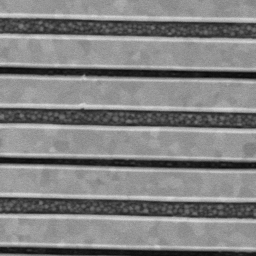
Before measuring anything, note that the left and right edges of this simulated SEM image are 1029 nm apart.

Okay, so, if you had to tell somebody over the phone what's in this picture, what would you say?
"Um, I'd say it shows parallel lines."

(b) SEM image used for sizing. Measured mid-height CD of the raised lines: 124 nanometers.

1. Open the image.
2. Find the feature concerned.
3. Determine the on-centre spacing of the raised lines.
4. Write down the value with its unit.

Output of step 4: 0.181 microns